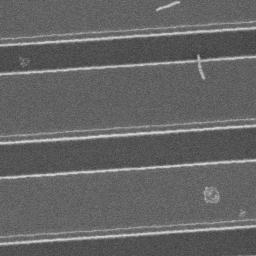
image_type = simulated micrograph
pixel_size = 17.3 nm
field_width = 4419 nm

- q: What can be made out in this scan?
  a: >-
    lines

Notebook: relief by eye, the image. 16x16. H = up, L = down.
HHHHHHHHHHHHHHHH
HHHHHHHHHHHHHHHH
HHHHHLLLLLLLLLLL
LLLLLLLLLLLLLLLL
LLLHHHHHHHHHHHHH
HHHHHHHHHHHHHHHH
HHHHHHHHHHHHHHHH
HHHHHHHHHHHHHHHH
HHHHHHLLLLLLLLLL
LLLLLLLLLLLLLLLL
LLLLLLLLLHHHHHHH
HHHHHHHHHHHHHHHH
HHHHHHHHHHHHHHHH
HHHHHHHHHHHHHHHH
HHHHHHHHHHHLLLLL
LLLLLLLLLLLLLLLL